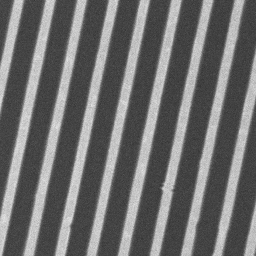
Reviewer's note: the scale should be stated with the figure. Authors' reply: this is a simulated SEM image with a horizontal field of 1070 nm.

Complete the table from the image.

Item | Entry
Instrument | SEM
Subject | parallel lines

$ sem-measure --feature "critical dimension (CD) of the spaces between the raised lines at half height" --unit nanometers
78.7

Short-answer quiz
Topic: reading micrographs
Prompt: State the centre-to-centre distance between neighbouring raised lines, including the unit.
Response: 129 nm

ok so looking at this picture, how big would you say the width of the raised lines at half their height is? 48.6 nm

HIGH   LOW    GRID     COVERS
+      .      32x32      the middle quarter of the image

+++.....++.....+++.....+++.....+
++.....+++.....+++.....+++.....+
++.....+++.....+++.....+++.....+
++.....+++.....+++.....+++.....+
++.....++.....+++.....+++.....++
+.....+++.....+++.....+++.....++
+.....+++.....+++.....+++.....++
+.....+++.....+++.....+++.....++
+.....+++.....+++.....++.....+++
+.....++......++.....+++.....+++
......++.....+++.....+++.....+++
.....+++.....+++.....+++.....+++
.....+++.....+++.....+++....++++
.....+++.....+++....++++....+++.
....+++.....+++.....+++.....+++.
....+++.....+++.....+++.....+++.
....+++.....+++.....+++.....+++.
....+++.....+++.....+++.....+++.
....+++.....+++....++++....+++..
...+++.....+++.....+++.....+++..
...+++.....+++.....+++.....+++..
...+++.....+++.....+++.....+++..
...+++.....+++.....+++.....++...
...++......++.....+++.....+++...
...++.....+++.....+++.....+++...
..+++.....+++.....+++.....+++...
..+++.....+++.....+++.....+++...
..+++.....+++.....+++.....++....
..++......++.....+++.....+++....
..++.....+++.....+++.....+++....
.+++.....+++.....+++.....+++....
.+++.....+++.....+++.....++.....